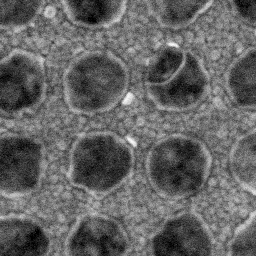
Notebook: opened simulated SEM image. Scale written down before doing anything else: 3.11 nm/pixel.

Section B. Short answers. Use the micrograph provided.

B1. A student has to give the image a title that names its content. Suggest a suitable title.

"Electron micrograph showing raised bodies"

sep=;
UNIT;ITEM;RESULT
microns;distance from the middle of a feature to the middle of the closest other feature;0.245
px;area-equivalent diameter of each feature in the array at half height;64.6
